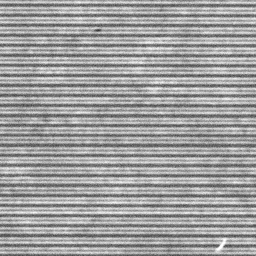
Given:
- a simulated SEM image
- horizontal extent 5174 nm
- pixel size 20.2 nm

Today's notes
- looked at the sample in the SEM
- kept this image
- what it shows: parallel lines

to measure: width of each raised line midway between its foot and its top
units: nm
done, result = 106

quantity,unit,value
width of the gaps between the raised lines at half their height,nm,104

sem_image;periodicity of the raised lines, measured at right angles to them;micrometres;0.202